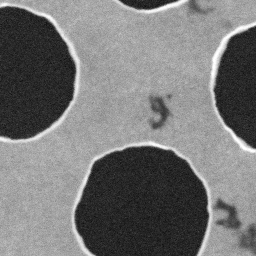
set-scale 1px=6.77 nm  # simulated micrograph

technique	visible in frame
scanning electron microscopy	holes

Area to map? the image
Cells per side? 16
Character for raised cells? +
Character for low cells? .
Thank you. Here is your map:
.+++++++..++++++
...+++++++++++++
....++++++++++..
.....+++++++++..
.....++++++++...
.....++++++++...
....+++++++++...
....++++++++++..
..+++++++++++++.
+++++++....+++++
++++++......++++
+++++........+++
+++++........+++
+++++........+++
+++++........+++
+++++........+++